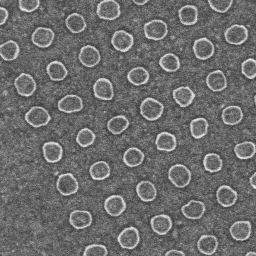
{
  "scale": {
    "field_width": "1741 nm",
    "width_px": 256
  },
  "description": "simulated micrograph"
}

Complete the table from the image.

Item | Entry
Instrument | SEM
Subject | a regular array of raised bodies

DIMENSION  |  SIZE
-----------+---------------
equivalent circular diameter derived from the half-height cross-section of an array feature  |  135 nm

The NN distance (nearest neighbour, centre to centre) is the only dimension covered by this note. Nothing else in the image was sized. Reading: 35.4 px